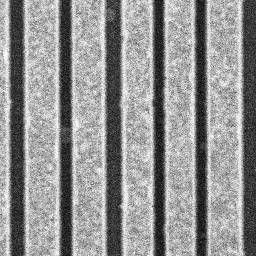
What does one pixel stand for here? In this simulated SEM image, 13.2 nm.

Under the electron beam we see parallel lines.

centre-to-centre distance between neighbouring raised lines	0.602	um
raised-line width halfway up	436	nm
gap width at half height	174	nanometres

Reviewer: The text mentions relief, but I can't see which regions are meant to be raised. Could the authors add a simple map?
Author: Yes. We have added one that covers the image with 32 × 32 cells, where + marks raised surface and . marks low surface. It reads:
+..++++..++++..++++..+++..++++..
+..++++..++++..++++..+++..++++..
+..++++..++++..++++..+++..++++..
+..++++..++++..++++..+++..++++..
+..++++..++++..++++..+++..++++..
+..++++..++++..++++..+++..++++..
+..++++..++++..++++..+++..++++..
+..++++..++++..++++..+++..++++..
+..++++..++++..++++..+++..++++..
+..++++..++++..++++..+++..++++..
+..++++..++++..++++..+++..++++..
+..++++..++++..++++..+++..++++..
+..++++..++++..++++..+++..++++..
+..++++..++++..++++..+++..++++..
+..++++..++++..++++..+++..++++..
+..++++..++++..++++..+++..++++..
+..++++..++++..++++..+++..++++..
+..++++..++++..++++..+++..++++..
+..++++..++++..++++..+++..++++..
+..++++..++++..++++..+++..++++..
+..++++..++++..++++..+++..++++..
+..++++..++++..++++..+++..++++..
+..++++..++++..++++..+++..++++..
+..++++..++++..++++..+++..++++..
+..++++..++++..++++..+++..++++..
+..++++..++++..++++..+++..++++..
+..++++..++++..++++..+++..++++..
+..++++..++++..++++..+++..++++..
+..++++..++++..++++..+++..++++..
+..++++..++++..++++..+++..++++..
+..++++..++++..++++..+++..++++..
+..++++..++++..++++..+++..++++..